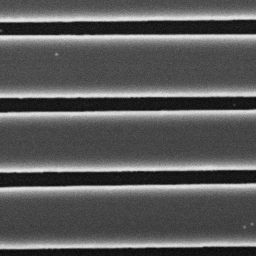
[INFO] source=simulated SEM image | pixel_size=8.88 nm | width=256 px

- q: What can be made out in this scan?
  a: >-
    lines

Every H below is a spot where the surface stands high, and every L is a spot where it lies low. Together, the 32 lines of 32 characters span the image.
HHHHHHHHHHHHHHHHHHHHHHHHHHHHHHHH
HHHHHHHHHHHHHHHHHHHHHHHHHHHHHHHH
HHHHHHHLHLLLLLLLLLLLLLLLLLLLLLLL
LLLLLLLLLLLLLLLLLLLLLLLLLLLLLLLL
LLLLLLLLHLLLLHHHHHHHHHHHHHHHHHHH
HHHHHHHHHHHHHHHHHHHHHHHHHHHHHHHH
HHHHHHHHHHHHHHHHHHHHHHHHHHHHHHHH
HHHHHHHHHHHHHHHHHHHHHHHHHHHHHHHH
HHHHHHHHHHHHHHHHHHHHHHHHHHHHHHHH
HHHHHHHHHHHHHHHHHHHHHHHHHHHHHHHH
HHHHHHHHHHHHHHHHHHHHHHHHHHHHHHHH
HHHHHHHHHHHHHHHHHHHHHHHHHHHHHHHH
LLLLLLLLLLLLLLLLLLLLLLLLLLLLLLLL
LLLLLLLLLLLLLLLLLLLLLLLLLLLLLLLL
HHHHHHHHHHHHHHHHHHHHHHHHHHHHHHHH
HHHHHHHHHHHHHHHHHHHHHHHHHHHHHHHH
HHHHHHHHHHHHHHHHHHHHHHHHHHHHHHHH
HHHHHHHHHHHHHHHHHHHHHHHHHHHHHHHH
HHHHHHHHHHHHHHHHHHHHHHHHHHHHHHHH
HHHHHHHHHHHHHHHHHHHHHHHHHHHHHHHH
HHHHHHHHHHHHHHHHHHHHHHHHHHHHHHHH
LLLLLLLLLLLLLLLLLLLLLLLLLLLLLLLL
LLLLLLLLLLLLLLLLLLLLLLLLLLLLLLLL
LLLLLLLLHHHHHHHHHHHHHHHHHHHHHHHH
HHHHHHHHHHHHHHHHHHHHHHHHHHHHHHHH
HHHHHHHHHHHHHHHHHHHHHHHHHHHHHHHH
HHHHHHHHHHHHHHHHHHHHHHHHHHHHHHHH
HHHHHHHHHHHHHHHHHHHHHHHHHHHHHHHH
HHHHHHHHHHHHHHHHHHHHHHHHHHHHHHHH
HHHHHHHHHHHHHHHHHHHHHHHHHHHHHHHH
HHHHHHHHHHHHHHHHHHHHHHHHHHHHHHHH
LLLLLLLLLLLLLLLLLLLLLLLLLLLLLLLL